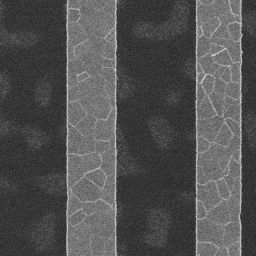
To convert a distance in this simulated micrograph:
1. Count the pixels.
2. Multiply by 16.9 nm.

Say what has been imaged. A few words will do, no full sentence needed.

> one or a few lines or trenches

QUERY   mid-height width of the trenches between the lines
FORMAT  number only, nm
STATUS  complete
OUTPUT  1370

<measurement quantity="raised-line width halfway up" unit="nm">782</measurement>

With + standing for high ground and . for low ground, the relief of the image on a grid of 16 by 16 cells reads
....+++.....+++.
....+++.....+++.
....+++.....+++.
....+++.....+++.
....+++.....+++.
....+++.....+++.
....+++.....+++.
....+++.....+++.
....+++.....+++.
....+++.....+++.
....+++.....+++.
....+++.....+++.
....+++.....+++.
....+++.....+++.
....+++.....+++.
....+++.....+++.